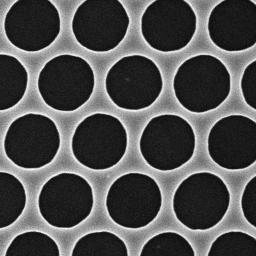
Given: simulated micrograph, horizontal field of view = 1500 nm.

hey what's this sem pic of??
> a regular array of holes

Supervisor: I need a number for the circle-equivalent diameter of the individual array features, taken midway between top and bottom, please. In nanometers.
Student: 327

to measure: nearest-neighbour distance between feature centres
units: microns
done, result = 0.396